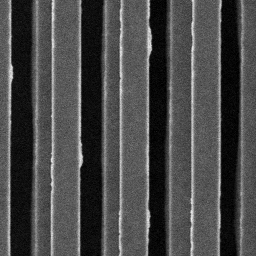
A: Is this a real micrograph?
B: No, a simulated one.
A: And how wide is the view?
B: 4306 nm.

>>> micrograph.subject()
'lines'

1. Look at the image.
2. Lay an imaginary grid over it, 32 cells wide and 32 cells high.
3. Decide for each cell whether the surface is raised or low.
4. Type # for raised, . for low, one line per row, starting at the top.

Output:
#....#####...######..#######..##
#....#####...######..#######..##
#....#####...######..#######..##
#....#####...######..#######..##
#....#####...######..#######..##
#....#####...######..#######..##
#...######...######..#######..##
#....#####...######..#######..##
##..######...######..#######..##
##..######...######..#######..##
#...######...######..#######..##
#...######...######..#######..##
#...######...######..#######..##
#...######...######..#######..##
#...######...######..#######..##
#...######...######..#######..##
#...######...######..#######..##
#...######...######..#######..##
#...######...######..#######..##
#...######...######..#######..##
#...######...######..#######..##
#...######...######..#######..##
#...######...######..#######..##
#...######...######..#######..##
#...######...######..#######..##
#...######...#####...######...##
#...######...######..#######..##
#...######...######..#######..##
#...######...######..#######..##
#...######...######..######...##
#...######...######..######...##
#...######...#####...######...##